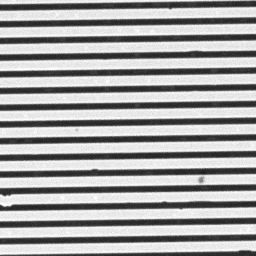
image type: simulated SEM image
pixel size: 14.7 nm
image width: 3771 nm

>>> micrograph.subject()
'parallel lines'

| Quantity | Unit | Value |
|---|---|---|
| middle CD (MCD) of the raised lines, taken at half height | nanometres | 151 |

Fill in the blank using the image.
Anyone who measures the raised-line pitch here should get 246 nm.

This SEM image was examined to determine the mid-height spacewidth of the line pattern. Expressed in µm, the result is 0.0957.